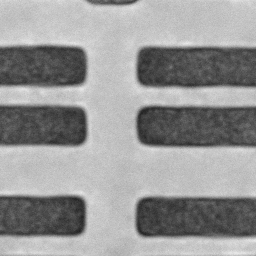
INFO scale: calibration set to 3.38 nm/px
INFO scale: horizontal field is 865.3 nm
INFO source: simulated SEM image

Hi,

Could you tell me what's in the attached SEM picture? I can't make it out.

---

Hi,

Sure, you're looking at groups of lines, slits or small figures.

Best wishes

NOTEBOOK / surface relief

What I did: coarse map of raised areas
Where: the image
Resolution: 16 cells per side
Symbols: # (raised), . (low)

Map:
################
################
################
.....####.......
.....####.......
################
################
.....####.......
.....####.......
################
################
################
.....####.......
.....###........
.....####.......
################